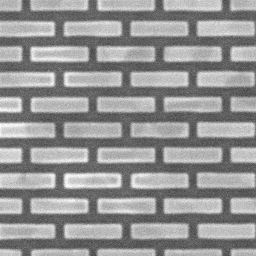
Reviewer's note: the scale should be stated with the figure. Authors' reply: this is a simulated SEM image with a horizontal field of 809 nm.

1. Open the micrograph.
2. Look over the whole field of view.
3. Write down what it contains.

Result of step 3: groups of lines, slits or small figures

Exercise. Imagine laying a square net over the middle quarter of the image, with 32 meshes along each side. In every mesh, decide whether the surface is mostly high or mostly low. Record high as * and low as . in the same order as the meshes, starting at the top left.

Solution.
................................
................................
.*************...**************.
.*************...**************.
.*************...**************.
................................
................................
................................
................................
******...*************...*******
******...**************..*******
******...**************..*******
................................
................................
................................
**************...**************.
**************...**************.
**************...**************.
................................
................................
................................
******...**************..*******
******...**************..*******
******...**************..*******
................................
................................
................................
......................*****.....
.*************...**************.
.*************...**************.
.***********.....**************.
................................